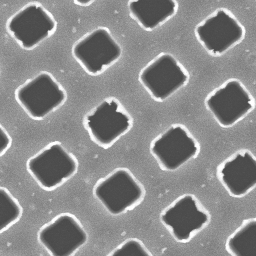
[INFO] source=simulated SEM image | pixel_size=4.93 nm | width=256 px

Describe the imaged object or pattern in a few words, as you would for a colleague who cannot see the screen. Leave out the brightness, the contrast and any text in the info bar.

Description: a regular array of holes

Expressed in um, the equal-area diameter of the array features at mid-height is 0.182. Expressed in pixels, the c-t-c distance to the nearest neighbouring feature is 71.